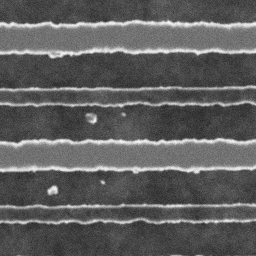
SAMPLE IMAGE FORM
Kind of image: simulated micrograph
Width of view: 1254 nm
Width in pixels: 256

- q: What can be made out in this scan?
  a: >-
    lines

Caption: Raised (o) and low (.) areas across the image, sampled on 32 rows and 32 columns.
................................
................................
................................
oooooooooooooooooooooooooooooooo
oooooooooooooooooooooooooooooooo
oooooooooooooooooooooooooooooooo
ooooooooooo.....oooo....oo.ooooo
................................
................................
................................
................................
oooooooooooooooooooooooooooooooo
oooooooooooooooooooooooooooooooo
................................
................................
................................
................................
.......o...............oooooo...
oooooooooooooooooooooooooooooooo
oooooooooooooooooooooooooooooooo
oooooooooooooooooooooooooooooooo
................................
................................
................................
................................
................................
oooooooooooooooooooooooooooooooo
oooooooooooooooooooooooooooooooo
................................
................................
................................
................................